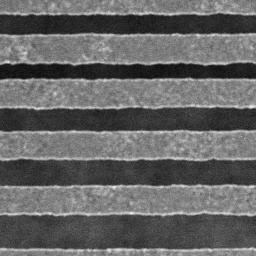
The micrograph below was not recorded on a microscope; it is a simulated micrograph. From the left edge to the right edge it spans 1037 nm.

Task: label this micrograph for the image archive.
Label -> lines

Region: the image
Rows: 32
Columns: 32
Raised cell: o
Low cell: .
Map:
oooooooooooooooooooooooooooooooo
oooooooooooooooooooooooooooooooo
................................
................................
oooooooooooooooooooooooooooooooo
oooooooooooooooooooooooooooooooo
oooooooooooooooooooooooooooooooo
oooooooooooooooooooooooooooooooo
................................
................................
oooooooooooooooooooooooooooooooo
oooooooooooooooooooooooooooooooo
oooooooooooooooooooooooooooooooo
....ooo.o.ooooo....o............
................................
................................
oooooooooooooooooooooooooooooooo
oooooooooooooooooooooooooooooooo
oooooooooooooooooooooooooooooooo
oooooooooooooooooooooooooooooooo
................................
................................
................................
oooooooooooooooooooooooooooooooo
oooooooooooooooooooooooooooooooo
oooooooooooooooooooooooooooooooo
oooooooooooooooooooooooooooooooo
................................
................................
................................
................................
oooooooooooooooooooooooooooooooo